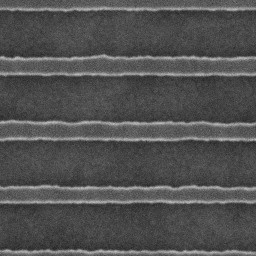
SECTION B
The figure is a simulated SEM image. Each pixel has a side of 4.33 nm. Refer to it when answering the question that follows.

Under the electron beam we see lines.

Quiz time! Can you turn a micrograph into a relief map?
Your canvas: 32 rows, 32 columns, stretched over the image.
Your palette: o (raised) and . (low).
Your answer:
oooooooooooooooooooooooooooooooo
................................
................................
................................
................................
................................
................................
oooooooooooooooooooooooooooooooo
oooooooooooooooooooooooooooooooo
................................
................................
................................
................................
................................
................................
oooooooooooooooooooooooooooo.ooo
oooooooooooooooooooooooooooooooo
o.....o......oooooooooo..o.ooooo
................................
................................
................................
................................
................................
oooooooooooooooooooooooooooo.ooo
oooooooooooooooooooooooooooooooo
................................
................................
................................
................................
................................
................................
oooooooooooooooooooooooooooooooo